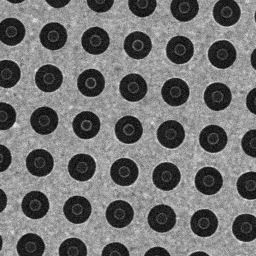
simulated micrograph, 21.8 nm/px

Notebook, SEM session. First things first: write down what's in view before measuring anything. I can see an array of small figures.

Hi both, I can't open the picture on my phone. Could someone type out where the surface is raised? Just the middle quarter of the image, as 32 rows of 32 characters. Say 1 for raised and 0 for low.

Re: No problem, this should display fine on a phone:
11111111111111111111111111111111
11111000011111111111111111111111
11110000001111110001111111111111
11100000001111100000111111100111
11100011001111000000011110000001
11100011001111001110011110000001
11110000001111001100011100011000
11110000011111000000011100011000
11111111111111100000111110000001
11111111111111111011111110000001
11111111111111111111111111100111
11111111111111111111111111111111
11100000111111111111111111111111
11000000011111000011111111111111
11000100011110000001111110000111
11001110011110011000111100000011
11000000011110011000111000100011
11100000111110001000111000110011
11110001111110000001111000100011
11111111111111000011111100000011
11111111111111111111111110000111
11111111111111111111111111111111
11100011111111111111111111111111
11000001111111001111111111111111
10000000111100000011111100011111
10011100111100000001111000001111
10011100111000110001110000000111
10000000111000110001110001100111
11000001111100000001110001100111
11110111111100000011110000000111
11111111111111000111111000001111
11111111111111111111111100011111